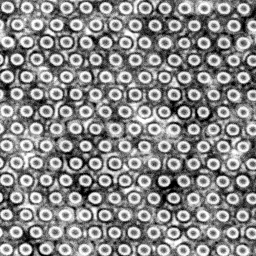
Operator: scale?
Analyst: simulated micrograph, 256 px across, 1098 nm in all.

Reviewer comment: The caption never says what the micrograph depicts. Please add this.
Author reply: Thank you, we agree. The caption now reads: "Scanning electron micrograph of a regular array of raised bodies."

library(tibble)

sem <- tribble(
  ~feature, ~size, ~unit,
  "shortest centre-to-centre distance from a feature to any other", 83.5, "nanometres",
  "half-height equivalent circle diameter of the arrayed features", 47.9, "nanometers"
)